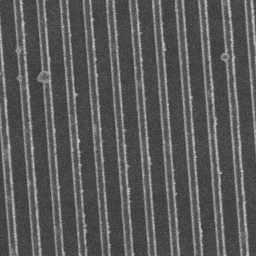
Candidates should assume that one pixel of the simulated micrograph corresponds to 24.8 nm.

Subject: parallel lines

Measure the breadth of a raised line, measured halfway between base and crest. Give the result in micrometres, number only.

0.186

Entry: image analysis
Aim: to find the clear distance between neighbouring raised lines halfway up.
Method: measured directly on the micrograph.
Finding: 390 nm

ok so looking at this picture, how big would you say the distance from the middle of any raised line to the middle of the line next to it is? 572 nm